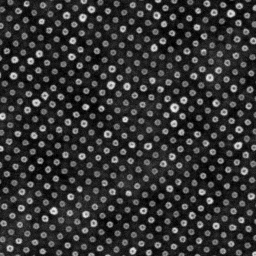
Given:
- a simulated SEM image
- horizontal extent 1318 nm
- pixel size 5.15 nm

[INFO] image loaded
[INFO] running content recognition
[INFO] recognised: a regular array of raised bodies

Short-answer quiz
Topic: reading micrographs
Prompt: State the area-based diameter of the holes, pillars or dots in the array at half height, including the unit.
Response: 29.1 nanometers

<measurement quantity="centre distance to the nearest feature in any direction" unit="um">0.0581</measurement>